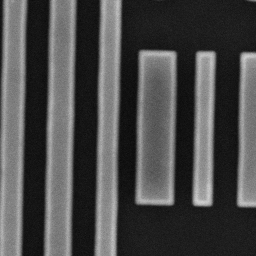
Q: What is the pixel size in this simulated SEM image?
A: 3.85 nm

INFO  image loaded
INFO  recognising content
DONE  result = groups of lines, slits or small figures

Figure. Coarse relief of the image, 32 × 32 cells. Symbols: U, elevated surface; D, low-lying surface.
DUUDDDDUUDDDDUUDDDDDDDDDDDDDDDDD
DUUDDDDUUDDDDUUDDDDDDDDDDDDDDDDD
DUUDDDUUUDDDDUUDDDDDDDDDDDDDDDDD
DUUDDDUUUDDDDUUDDDDDDDDDDDDDDDDD
DUUDDDUUUDDDDUUDDDDDDDDDDDDDDDDD
DUUDDDUUUDDDDUUDDDDDDDDDDDDDDDDD
DUUDDDUUUDDDDUUDDDDDDDDDDDDDDDDD
DUUDDDUUUDDDDUUDDDUUUUDDDUUDDDUU
UUUDDDUUUDDDDUUDDDUUUUDDDUUDDDUU
UUUDDDUUUDDDDUUDDDUUUUDDDUUDDDUU
UUUDDDUUUDDDDUUDDUUUUUDDDUUDDDUU
UUUDDDUUUDDDDUUDDUUUUUDDDUUDDDUU
UUUDDDUUUDDDDUUDDUUUUUDDDUDDDDUU
UUUDDDUUUDDDDUUDDUUUUUDDDUDDDDUU
UUUDDDUUUDDDDUUDDUUUUUDDDUDDDDUU
UUUDDDUUUDDDUUUDDUUUUUDDDUDDDDUU
UUUDDDUUUDDDUUDDDUUUUUDDDUDDDDUU
UUUDDDUUUDDDUUDDDUUUUUDDDUDDDDUU
UUUDDDUUUDDDUUDDDUUUUUDDDUDDDDUU
UUUDDDUUUDDDUUDDDUUUUUDDUUDDDDUU
UUUDDDUUUDDDUUDDDUUUUUDDUUDDDDUU
UUUDDDUUUDDDUUDDDUUUUUDDUUDDDDUU
UUUDDDUUUDDDUUDDDUUUUDDDUUDDDDUU
UUUDDDUUUDDDUUDDDUUUUDDDUUDDDDUU
UUUDDDUUUDDDUUDDDUUUUDDDUUDDDDUU
UUUDDDUUUDDDUUDDDDDDDDDDDDDDDDUU
UUDDDDUUUDDDUUDDDDDDDDDDDDDDDDDD
UUDDDDUUUDDDUUDDDDDDDDDDDDDDDDDD
UUDDDDUUUDDDUUDDDDDDDDDDDDDDDDDD
UUDDDDUUUDDDUUDDDDDDDDDDDDDDDDDD
UUDDDDUUUDDDUUDDDDDDDDDDDDDDDDDD
UUDDDDUUUDDDUUDDDDDDDDDDDDDDDDDD